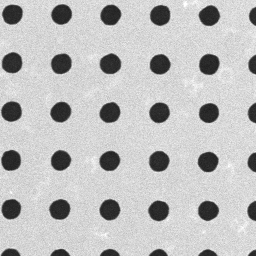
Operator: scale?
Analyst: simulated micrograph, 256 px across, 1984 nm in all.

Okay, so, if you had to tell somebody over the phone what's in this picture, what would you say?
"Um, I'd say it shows a regular array of holes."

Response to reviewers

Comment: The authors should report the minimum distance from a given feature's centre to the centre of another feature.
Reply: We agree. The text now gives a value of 0.377 µm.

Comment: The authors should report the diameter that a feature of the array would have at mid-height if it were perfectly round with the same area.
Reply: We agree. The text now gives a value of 158 nm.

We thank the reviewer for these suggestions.